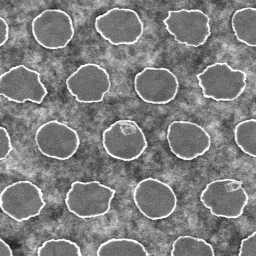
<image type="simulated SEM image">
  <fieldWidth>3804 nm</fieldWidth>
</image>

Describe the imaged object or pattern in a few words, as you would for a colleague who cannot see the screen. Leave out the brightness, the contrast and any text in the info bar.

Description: a regular array of raised bodies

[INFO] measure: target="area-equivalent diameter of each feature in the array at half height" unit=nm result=597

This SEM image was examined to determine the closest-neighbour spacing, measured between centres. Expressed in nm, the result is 968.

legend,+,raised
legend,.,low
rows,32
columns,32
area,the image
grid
................................
.....+++......+++....++++.....++
....+++++...+++++....+++++...+++
+...+++++...++++++...+++++...+++
+...+++++....+++++....++++....++
.....+++...............++......+
................................
................................
..+.......+++.............+++...
+++++....+++++...+++++...++++++.
+++++...++++++...+++++...++++++.
++++++...++++....+++++...+++++..
.++++.....+++.....+++.......+...
................................
................................
......++......+++....+++......++
+....++++....+++++...+++++...+++
+....+++++...+++++...+++++...+++
+....+++++...+++++...+++++....++
+.....+++.....+++.....+++.......
................................
................................
..................+.........+...
.++++....+++++...++++.....++++..
+++++...++++++...+++++...++++++.
+++++...++++++...+++++....+++++.
.++++....++++.....+++......+++..
..+.............................
................................
...............................+
+.....+++....+++++....++++....++
+....+++++..++++++....+++++...++